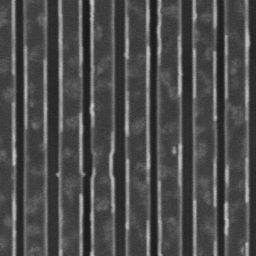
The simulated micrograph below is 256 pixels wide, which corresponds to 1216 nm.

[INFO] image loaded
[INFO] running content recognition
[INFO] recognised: parallel lines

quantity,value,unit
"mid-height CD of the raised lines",109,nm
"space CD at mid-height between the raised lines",42.1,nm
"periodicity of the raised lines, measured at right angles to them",159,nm